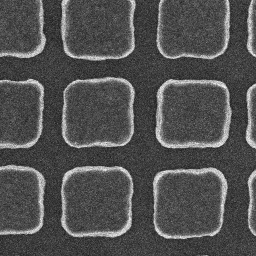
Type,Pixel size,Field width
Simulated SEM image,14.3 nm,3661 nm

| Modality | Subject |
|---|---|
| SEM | raised bodies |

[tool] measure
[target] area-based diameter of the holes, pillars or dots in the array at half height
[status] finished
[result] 1070 nanometers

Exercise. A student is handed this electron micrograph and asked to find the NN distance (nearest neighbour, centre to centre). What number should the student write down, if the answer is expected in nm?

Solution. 1270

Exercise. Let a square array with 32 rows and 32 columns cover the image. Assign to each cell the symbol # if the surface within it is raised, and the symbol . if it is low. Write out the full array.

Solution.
#####...#########...#########..#
#####...#########...#########..#
#####...#########...########...#
#####...#########...########...#
#####...#########...########...#
#####...#########...########...#
#####...########....########...#
................................
................................
................................
#####....#######.....#######....
#####...#########...#########..#
#####...########....#########..#
#####...########....#########..#
#####...#########...#########..#
#####...#########...#########..#
#####...#########...########...#
#####...########....########...#
................................
................................
................................
#####....#######.....######.....
#####...########....########...#
#####...#########..#########...#
#####...########...#########...#
#####...########...#########...#
#####...########...#########...#
#####...########...#########...#
#####...########...########....#
.....................#####......
................................
................................